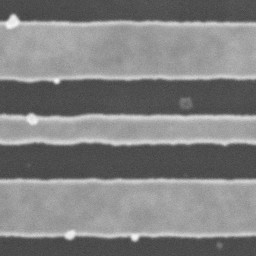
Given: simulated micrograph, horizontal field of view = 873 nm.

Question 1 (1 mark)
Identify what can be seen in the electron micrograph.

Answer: lines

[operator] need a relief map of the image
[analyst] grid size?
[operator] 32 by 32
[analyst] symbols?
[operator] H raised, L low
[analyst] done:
LLLLLLLLLLLLLLLLLLLLLLLLLLLLLLLL
LLLLLLLLLLLLLLLLLLLLLLLLLLLLLLLL
LHLLLLLLLLLLLLLLLLLLLLLLLLLLLLLL
HHHHHHHHHHHHHHHHHHHHHHHHHHHHHHHH
HHHHHHHHHHHHHHHHHHHHHHHHHHHHHHHH
HHHHHHHHHHHHHHHHHHHHHHHHHHHHHHHH
HHHHHHHHHHHHHHHHHHHHHHHHHHHHHHHH
HHHHHHHHHHHHHHHHHHHHHHHHHHHHHHHH
HHHHHHHHHHHHHHHHHHHHHHHHHHHHHHHH
HHHHHHHHHHHHHHHHHHHHHHHHHHHHHHHH
LLLLLLLLLLLLLLLLLLLLLLLLLLLLLLLL
LLLLLLLLLLLLLLLLLLLLLLLLLLLLLLLL
LLLLLLLLLLLLLLLLLLLLLLLLLLLLLLLL
LLLLLLLLLLLLLLLLLLLLLLLLLLLLLLLL
HHHHHLLLLLHHHHHHHHLHHHHLHHHHHLLL
HHHHHHHHHHHHHHHHHHHHHHHHHHHHHHHH
HHHHHHHHHHHHHHHHHHHHHHHHHHHHHHHH
HHHHHHHHHHHHHHHHHHHHHHHHHHHHHHHH
LLLLLLLLLLLLLLLLLLLLLLLLLLLLLLLL
LLLLLLLLLLLLLLLLLLLLLLLLLLLLLLLL
LLLLLLLLLLLLLLLLLLLLLLLLLLLLLLLL
LLLLLLLLLLLLLLLLLLLLLLLLLLLLLLLL
LLLLLLLLLLLHLLHHLLLHHLLLLLLLLLLL
HHHHHHHHHHHHHHHHHHHHHHHHHHHHHHHH
HHHHHHHHHHHHHHHHHHHHHHHHHHHHHHHH
HHHHHHHHHHHHHHHHHHHHHHHHHHHHHHHH
HHHHHHHHHHHHHHHHHHHHHHHHHHHHHHHH
HHHHHHHHHHHHHHHHHHHHHHHHHHHHHHHH
HHHHHHHHHHHHHHHHHHHHHHHHHHHHHHHH
LLHHHHHLHLLLHHHHHHHHLLHHHHHHHLLL
LLLLLLLLLLLLLLLLLLLLLLLLLLLLLLLL
LLLLLLLLLLLLLLLLLLLLLLLLLLLLLLLL